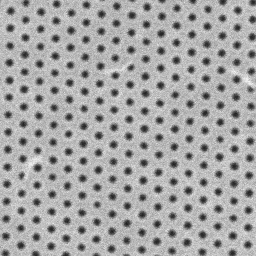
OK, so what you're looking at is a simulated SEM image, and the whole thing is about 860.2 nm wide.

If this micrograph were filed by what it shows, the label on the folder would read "a regular array of holes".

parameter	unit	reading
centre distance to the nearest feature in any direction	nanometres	57.4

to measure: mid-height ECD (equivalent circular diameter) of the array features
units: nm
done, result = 27.6